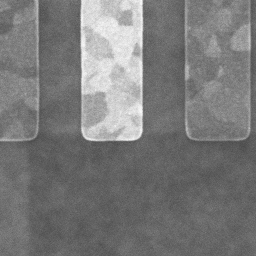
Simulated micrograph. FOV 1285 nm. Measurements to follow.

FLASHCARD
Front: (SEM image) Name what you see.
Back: wiring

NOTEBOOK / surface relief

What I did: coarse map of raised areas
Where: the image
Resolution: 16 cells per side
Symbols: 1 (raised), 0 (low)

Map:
1100011110001111
1100011110001111
1100011110001111
1100011110001111
1100011110001111
1100011110001111
1100011110001111
1100011110001111
1100011110001110
0000000000000000
0000000000000000
0000000000000000
0000000000000000
0000000000000000
0000000000000000
0000000000000000